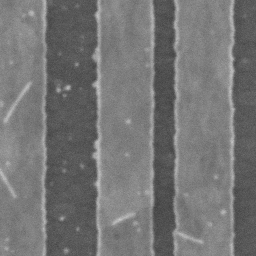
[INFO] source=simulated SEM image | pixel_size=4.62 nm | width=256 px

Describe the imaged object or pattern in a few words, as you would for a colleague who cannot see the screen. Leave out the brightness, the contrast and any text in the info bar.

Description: lines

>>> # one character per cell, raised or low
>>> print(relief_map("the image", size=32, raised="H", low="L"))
HHHHHHLLLLLLHHHHHHHLLLHHHHHHHLLL
HHHHHHLLLLLLHHHHHHHLLLHHHHHHHLLL
HHHHHHLLLLLLHHHHHHHLLLHHHHHHHLLL
HHHHHHLLLLLLHHHHHHHLLLHHHHHHHLLL
HHHHHLLLLLLLHHHHHHHLLLHHHHHHHLLL
HHHHHHLLLLLLHHHHHHHLLLHHHHHHHLLL
HHHHHHLLLLLLHHHHHHHLLLHHHHHHHLLL
HHHHHHLLLLLLHHHHHHHLLLHHHHHHHLLL
HHHHHHLLLLLLHHHHHHHLLLHHHHHHHLLL
HHHHHHLLLLLLHHHHHHHLLLHHHHHHHLLL
HHHHHHLLLLLLHHHHHHHLLLHHHHHHHLLL
HHHHHHLLLLLLHHHHHHHLLLHHHHHHHLLL
HHHHHHLLLLLLHHHHHHHLLLHHHHHHHLLL
HHHHHLLLLLLLHHHHHHHLLLHHHHHHHLLL
HHHHHHLLLLLLHHHHHHHLLLHHHHHHHLLL
HHHHHHLLLLLLHHHHHHHLLLHHHHHHHLLL
HHHHHHLLLLLLHHHHHHHLLLHHHHHHHLLL
HHHHHHLLLLLLHHHHHHHLLLHHHHHHHLLL
HHHHHHLLLLLLHHHHHHHLLLHHHHHHHLLL
HHHHHHLLLLLLHHHHHHHLLLHHHHHHHLLL
HHHHHHLLLLLLHHHHHHHLLLHHHHHHHLLL
HHHHHHLLLLLLHHHHHHHLLLHHHHHHHLLL
HHHHHLLLLLLLHHHHHHHLLLHHHHHHHLLL
HHHHHHLLLLLLHHHHHHHLLLHHHHHHHLLL
HHHHHHLLLLLLHHHHHHHLLLHHHHHHHLLL
HHHHHLLLLLLLHHHHHHHLLLHHHHHHHLLL
HHHHHHLLLLLLHHHHHHHLLLHHHHHHHLLL
HHHHHHLLLLLLHHHHHHHLLLHHHHHHHLLL
HHHHHHLLLLLLHHHHHHHLLLHHHHHHHLLL
HHHHHHLLLLLLHHHHHHHLLLHHHHHHHLLL
HHHHHHLLLLLLHHHHHHHLLLHHHHHHHLLL
HHHHHHLLLLLLHHHHHHHLLLHHHHHHHLLL